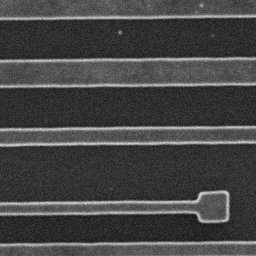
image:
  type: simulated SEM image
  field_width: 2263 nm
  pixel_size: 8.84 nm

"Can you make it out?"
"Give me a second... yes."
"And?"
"groups of lines, slits or small figures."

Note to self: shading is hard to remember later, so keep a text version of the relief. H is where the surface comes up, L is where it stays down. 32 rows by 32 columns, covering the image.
HHHHHHHHHHHHHHHHHHHHHHHHHHHHHHHH
HHHHHHHHHHHHHHHHHHHHHHHHHHHHHHHH
LLLLLLLLLLLLLLLLLLLLLLLLLLLLLLLL
LLLLLLLLLLLLLLLLLLLLLLLLLLLLLLLL
LLLLLLLLLLLLLLLLLLLLLLLLLLLLLLLL
LLLLLLLLLLLLLLLLLLLLLLLLLLLLLLLL
LLLLLLLLLLLLLLLLLLLLLLLLLLLLLLLL
LLLLLLHHHHHHHHHHHHHHHHHHHHHHHHHH
HHHHHHHHHHHHHHHHHHHHHHHHHHHHHHHH
HHHHHHHHHHHHHHHHHHHHHHHHHHHHHHHH
HHHHHHHHHHHHHHHHHHHHHHHHHHHHHHHH
LLLLLLLLLLLLLLLLLLLLLLLLLLLLLLLL
LLLLLLLLLLLLLLLLLLLLLLLLLLLLLLLL
LLLLLLLLLLLLLLLLLLLLLLLLLLLLLLLL
LLLLLLLLLLLLLLLLLLLLLLLLLLLLLLLL
LLLLLLLLLLLLLLLLLLLLLLLLLLLLLLLL
HHHHHHHHHHHHHHHHHHHHHHHHHHHHHHHH
HHHHHHHHHHHHHHHHHHHHHHHHHHHHHHHH
LLLLLLLLLLLLLLLLLLLLLLLLLLLLLLLL
LLLLLLLLLLLLLLLLLLLLLLLLLLLLLLLL
LLLLLLLLLLLLLLLLLLLLLLLLLLLLLLLL
LLLLLLLLLLLLLLLLLLLLLLLLLLLLLLLL
LLLLLLLLLLLLLLLLLLLLLLLLLLLLLLLL
LLLLLLLLLLLLLLLLLLLLLLLLLLLLLLLL
LLLLLLLLLLLLLLLLLLLLLLLLLHHHHLLL
HHHHHHHHHHHHHHHHHHHHHHHHHHHHHLLL
HHHHHHHHHHHHHHHHHHHHHHHHHHHHLLLL
LLLLLLLLLLLLLLLLLLLLLLLLLHHHLLLL
LLLLLLLLLLLLLLLLLLLLLLLLLLLLLLLL
LLLLLLLLLLLLLLLLLLLLLLLLLLLLLLLL
LLLLLLHHHHHHHHHHHHHHHHHHHHHHHHHH
HHHHHHHHHHHHHHHHHHHHHHHHHHHHHHHH